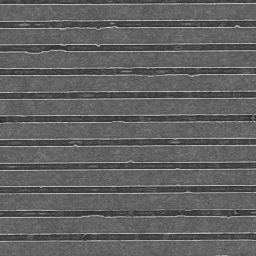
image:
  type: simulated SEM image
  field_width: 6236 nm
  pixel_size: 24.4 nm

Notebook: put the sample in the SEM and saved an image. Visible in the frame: parallel lines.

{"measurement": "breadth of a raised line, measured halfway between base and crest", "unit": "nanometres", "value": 408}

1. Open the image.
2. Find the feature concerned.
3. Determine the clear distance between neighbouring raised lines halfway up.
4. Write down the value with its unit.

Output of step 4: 0.164 micrometres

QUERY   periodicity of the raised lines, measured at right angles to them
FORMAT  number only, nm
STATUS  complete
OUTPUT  576